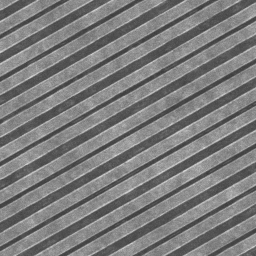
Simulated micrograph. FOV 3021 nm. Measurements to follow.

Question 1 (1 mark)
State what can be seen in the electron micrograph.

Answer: parallel lines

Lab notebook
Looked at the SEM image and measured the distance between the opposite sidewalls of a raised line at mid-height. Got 131 nm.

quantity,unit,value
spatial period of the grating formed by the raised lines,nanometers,217